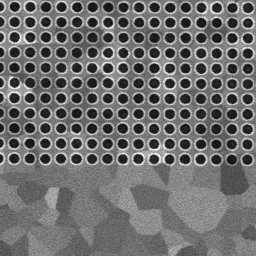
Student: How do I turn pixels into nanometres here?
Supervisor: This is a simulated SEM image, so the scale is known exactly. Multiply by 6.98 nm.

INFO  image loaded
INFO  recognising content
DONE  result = a regular array of holes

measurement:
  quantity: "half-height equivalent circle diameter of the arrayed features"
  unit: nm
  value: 78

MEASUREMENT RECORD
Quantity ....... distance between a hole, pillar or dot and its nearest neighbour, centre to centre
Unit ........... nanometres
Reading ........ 105